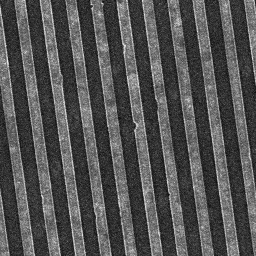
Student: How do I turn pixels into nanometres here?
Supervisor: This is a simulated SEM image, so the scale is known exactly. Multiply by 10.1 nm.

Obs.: parallel lines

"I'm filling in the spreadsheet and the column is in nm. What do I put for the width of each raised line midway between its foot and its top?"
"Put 104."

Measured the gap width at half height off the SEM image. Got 147 nm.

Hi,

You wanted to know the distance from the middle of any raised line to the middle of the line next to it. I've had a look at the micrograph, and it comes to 255 nanometres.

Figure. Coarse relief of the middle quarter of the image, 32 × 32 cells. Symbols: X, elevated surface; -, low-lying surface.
---XX----XXX----XX----XX----XXX-
---XX----XXX----XX----XX----XXX-
---XX----XXX----XX----XXX---XXX-
---XX-----XX----XX----XXX----XX-
---XXX----XX----XXX---XXX----XX-
---XXX----XX----XXX----XX----XX-
---XXX----XX----XXX----XX----XXX
----XX----XXX----XX----XX----XXX
----XX----XXX----XX----XX----XXX
----XX----XXX----XX----XXX---XXX
----XX----XXX----XX-----XX----XX
----XXX---XXX----XXX---XXX----XX
----XXX----XX----XXX----XX----XX
X---XXX----XX----XXX----XX----XX
X----XX----XX-----XX----XX----XX
X----XX----XXX----XX----XX----XX
X----XX----XXX----XX----XXX----X
X----XX----XXX----XX----XXX----X
X----XXX----XX----XXX---XXX----X
X----XXX----XX----XXX---XXX----X
XX----XX----XX----XXX----XX----X
XX----XX----XX----XXX----XX----X
XX----XX----XXX----XX----XX----X
XX----XX----XXX----XX----XX-----
XX----XXX---XXX----XX----XXX----
XX----XXX----XX----XX----XXX----
XX----XXX----XX----XXX---XXX----
XXX---XXX----XX----XXX----XX----
XXX----XX----XX----XXX----XX----
XXX----XX----XXX----XX----XX----
-XX----XX----XXX----XX----XX----
-XX----XXX---XXX----XX----XXX---